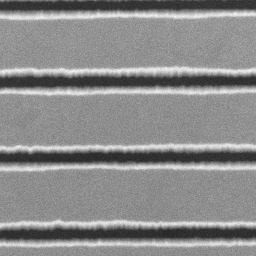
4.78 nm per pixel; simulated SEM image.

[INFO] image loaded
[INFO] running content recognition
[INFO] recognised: lines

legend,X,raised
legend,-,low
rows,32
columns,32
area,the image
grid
--------------------------------
---------------------------XXXXX
XXXXXXXXXXXXXXXXXXXXXXXXXXXXXXXX
XXXXXXXXXXXXXXXXXXXXXXXXXXXXXXXX
XXXXXXXXXXXXXXXXXXXXXXXXXXXXXXXX
XXXXXXXXXXXXXXXXXXXXXXXXXXXXXXXX
XXXXXXXXXXXXXXXXXXXXXXXXXXXXXXXX
XXXXXXXXXXXXXXXXXXXXXXXXXXXXXXXX
XXXXXXXXXXXXXXXXXXXXXXXXXXXXXXXX
--------------------------------
--------------------------------
XXXXXXXXXXXXXXXXXXXXXXXXXXXXXXXX
XXXXXXXXXXXXXXXXXXXXXXXXXXXXXXXX
XXXXXXXXXXXXXXXXXXXXXXXXXXXXXXXX
XXXXXXXXXXXXXXXXXXXXXXXXXXXXXXXX
XXXXXXXXXXXXXXXXXXXXXXXXXXXXXXXX
XXXXXXXXXXXXXXXXXXXXXXXXXXXXXXXX
XXXXXXXXXXXXXXXXXXXXXXXXXXXXXXXX
XXXXXXXXXXXXXXXXXXXXXXXXXXXXXXXX
--------------------------------
-----------XXX------XX----------
XXXXXXXXXXXXXXXXXXXXXXXXXXXXXXXX
XXXXXXXXXXXXXXXXXXXXXXXXXXXXXXXX
XXXXXXXXXXXXXXXXXXXXXXXXXXXXXXXX
XXXXXXXXXXXXXXXXXXXXXXXXXXXXXXXX
XXXXXXXXXXXXXXXXXXXXXXXXXXXXXXXX
XXXXXXXXXXXXXXXXXXXXXXXXXXXXXXXX
XXXXXXXXXXXXXXXXXXXXXXXXXXXXXXXX
--------------------------------
--------------------------------
XXXXXXXXXXXXXXXXXXXXXXXXXXXXXXXX
XXXXXXXXXXXXXXXXXXXXXXXXXXXXXXXX